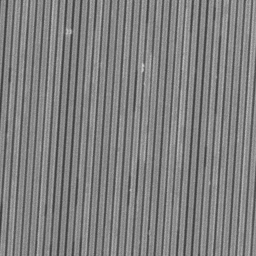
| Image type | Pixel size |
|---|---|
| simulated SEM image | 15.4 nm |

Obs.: parallel lines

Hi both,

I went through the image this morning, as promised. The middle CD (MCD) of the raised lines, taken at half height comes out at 70.9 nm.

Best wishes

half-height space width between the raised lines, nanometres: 42.2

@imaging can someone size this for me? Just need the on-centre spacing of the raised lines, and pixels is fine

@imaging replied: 7.4